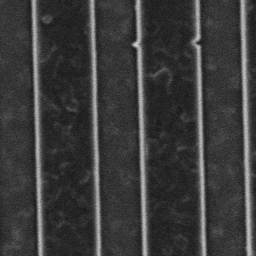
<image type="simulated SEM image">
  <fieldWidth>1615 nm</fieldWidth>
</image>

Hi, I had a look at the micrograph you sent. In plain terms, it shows one or a few lines or trenches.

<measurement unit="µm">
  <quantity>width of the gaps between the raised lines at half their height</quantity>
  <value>0.276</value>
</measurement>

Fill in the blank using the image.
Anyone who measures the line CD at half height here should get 379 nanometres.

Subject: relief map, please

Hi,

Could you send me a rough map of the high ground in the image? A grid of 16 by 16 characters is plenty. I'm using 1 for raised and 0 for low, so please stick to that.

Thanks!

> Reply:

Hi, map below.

0011110001110001
0011110001110001
0011110001110001
0011110001110001
0011110001110001
0011110001110001
0011110001111001
0011110001111001
0011110001111001
0011110001111001
0011110001111001
0011110001111001
0011110001111001
0011110001111001
0011110001111001
0011110001111001